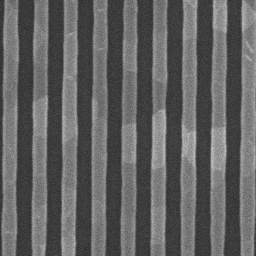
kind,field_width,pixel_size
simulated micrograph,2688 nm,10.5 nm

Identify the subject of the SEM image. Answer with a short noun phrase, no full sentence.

wiring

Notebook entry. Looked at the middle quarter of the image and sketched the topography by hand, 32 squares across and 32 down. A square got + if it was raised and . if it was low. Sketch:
+++....++++....+++....+++.....++
+++....++++....+++....+++.....++
+++....++++....+++....++++....++
+++....++++....+++....++++....++
+++....++++....+++....+++.....++
+++....++++....+++....+++.....++
+++....++++....+++....+++.....++
+++....++++....+++....+++.....++
+++....++++....+++....+++.....++
+++....++++....+++....+++.....++
+++....++++....+++....+++.....++
+++....++++....+++....+++.....++
+++....++++....+++....+++.....++
+++....++++....+++....+++.....++
+++....++++....+++....+++.....++
+++....++++....+++....+++.....++
+++....++++....+++....+++.....++
+++....++++....+++....+++.....++
+++....++++....+++....+++.....++
+++....++++....+++....+++.....++
+++....++++....+++....+++.....++
+++....++++....+++....+++.....++
+++....++++....+++....+++....+++
+++....++++....+++....+++....+++
+++....++++....+++....+++....+++
+++....++++....+++....+++....+++
+++....+++.....+++....+++....+++
+++....+++.....+++....+++....+++
+++....+++.....+++....+++....+++
+++....+++.....+++....+++....+++
+++....+++.....+++....+++....+++
+++....+++.....+++....+++....+++